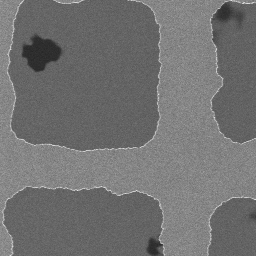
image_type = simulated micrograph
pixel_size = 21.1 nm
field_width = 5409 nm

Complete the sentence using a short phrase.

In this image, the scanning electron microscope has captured holes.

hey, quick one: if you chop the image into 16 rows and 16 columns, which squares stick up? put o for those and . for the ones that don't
o........ooooo..
o.........ooo...
o.........ooo...
o.........oooo..
o.........oooo..
o.........oooo..
o.........ooo...
o.........ooo...
o.........oooo..
oooooooooooooooo
oooooooooooooooo
oooooooooooooooo
o.........oooo..
..........ooo...
o.........ooo...
o.........ooo...